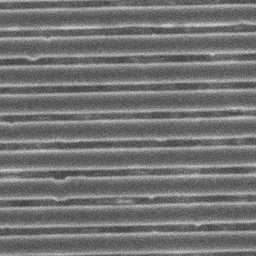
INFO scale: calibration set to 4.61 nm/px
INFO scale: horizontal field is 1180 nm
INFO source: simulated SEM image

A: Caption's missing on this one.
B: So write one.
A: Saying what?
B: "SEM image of parallel lines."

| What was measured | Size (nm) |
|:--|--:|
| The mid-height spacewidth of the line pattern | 39.7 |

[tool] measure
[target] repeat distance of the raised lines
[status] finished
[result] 130 nanometres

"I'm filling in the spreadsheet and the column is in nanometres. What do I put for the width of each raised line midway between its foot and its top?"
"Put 93.2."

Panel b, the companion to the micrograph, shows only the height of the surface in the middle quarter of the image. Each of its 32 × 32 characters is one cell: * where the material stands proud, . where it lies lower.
********************************
********************************
********************************
********************************
***************************.....
................................
................................
********************************
********************************
********************************
********************************
********************************
................................
................................
********************************
********************************
********************************
********************************
********************************
................................
................................
.......*************************
********************************
********************************
********************************
********************************
................................
................................
.*******************************
********************************
********************************
********************************